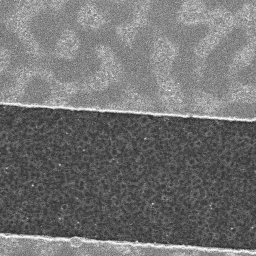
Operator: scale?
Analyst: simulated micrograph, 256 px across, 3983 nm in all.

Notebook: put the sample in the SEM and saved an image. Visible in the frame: one or a few lines or trenches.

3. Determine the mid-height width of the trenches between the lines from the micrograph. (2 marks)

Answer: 2050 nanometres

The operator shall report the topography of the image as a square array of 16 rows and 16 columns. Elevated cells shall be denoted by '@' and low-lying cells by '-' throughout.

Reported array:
@@@@@@@@@@@@@@@@
@@@@@@@@@@@@@@@@
@@@@@@@@@@@@@@@@
@@@@@@@@@@@@@@@@
@@@@@@@@@@@@@@@@
@@@@@@@@@@@@@@@@
-@@@@@@@@@@@@@@@
----------------
----------------
----------------
----------------
----------------
----------------
----------------
----------------
@@@@@@@@@@@@----